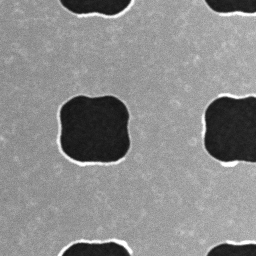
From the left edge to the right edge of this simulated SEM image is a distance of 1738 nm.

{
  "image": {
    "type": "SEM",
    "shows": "holes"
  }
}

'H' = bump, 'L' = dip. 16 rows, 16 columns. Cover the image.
HHHHLLLLHHHHHLLL
HHHHHHHHHHHHHHHH
HHHHHHHHHHHHHHHH
HHHHHHHHHHHHHHHH
HHHHHHHHHHHHHHHH
HHHHHHHHHHHHHHHH
HHHHLLLLHHHHHLLL
HHHHLLLLHHHHHLLL
HHHHLLLLHHHHHLLL
HHHHLLLLHHHHHLLL
HHHHHHHHHHHHHHHH
HHHHHHHHHHHHHHHH
HHHHHHHHHHHHHHHH
HHHHHHHHHHHHHHHH
HHHHHHHHHHHHHHHH
HHHHLLLLHHHHHLLL